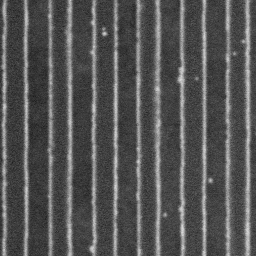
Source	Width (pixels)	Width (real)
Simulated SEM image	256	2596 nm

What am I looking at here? lines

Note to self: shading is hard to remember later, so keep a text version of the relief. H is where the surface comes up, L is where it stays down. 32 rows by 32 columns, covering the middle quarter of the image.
HLLLLLLHHHHHHLLLLLHHHHHLLLLLLLHH
HLLLLLLHHHHHHLLLLLLHHHHLLLLLLLHH
HLLLLLLHHHHHHLLLLLLHHHHLLLLLLHHH
HLLLLLLHHHHHHLLLLLLHHHHLLLLLLHHH
HLLLLLLHHHHHHLLLLLLHHHHLLLLLLHHH
HLLLLLLHHHHHHLLLLLHHHHHLLLLLLHHH
HLLLLLLHHHHHHLLLLLHHHHHLLLLLLHHH
HLLLLLLHHHHHHLLLLLHHHHHLLLLLLLHH
HLLLLLLHHHHHHLLLLLHHHHHLLLLLLLHH
HLLLLLLHHHHHHLLLLLLHHHHLLLLLLLHH
HLLLLLLHHHHHHLLLLLHHHHHLLLLLLHHH
HLLLLLLHHHHHHLLLLLHHHHHLLLLLLHHH
HLLLLLLHHHHHHLLLLLHHHHHLLLLLLHHH
HLLLLLLHHHHHHLLLLLHHHHHLLLLLLHHH
HLLLLLLHHHHHHLLLLLLHHHHLLLLLLLHH
HLLLLLLHHHHHHLLLLLLHHHHLLLLLLLHH
HLLLLLLHHHHHHLLLLLLHHHHLLLLLLHHH
HLLLLLLHHHHHHLLLLLLHHHHLLLLLLLHH
HLLLLLLHHHHHHLLLLLLHHHHLLLLLLLHH
HHLLLLLHHHHHHLLLLLLHHHHLLLLLLLHH
HLLLLLLHHHHHHLLLLLLHHHHLLLLLLLHH
HLLLLLLHHHHHHLLLLLLHHHHLLLLLLLHH
HLLLLLLHHHHHHLLLLLLHHHHLLLLLLLHH
HLLLLLLHHHHHHLLLLLLHHHHLLLLLLLHH
HLLLLLLHHHHHHLLLLLLHHHHLLLLLLLHH
HLLLLLLHHHHHHLLLLLLHHHHLLLLLLLHH
HLLLLLLHHHHHHLLLLLHHHHHLLLLLLHHH
HLLLLLLHHHHHHLLLLLLHHHHLLLLLLLHH
HLLLLLLHHHHHHLLLLLLHHHHLLLLLLLHH
HLLLLLLHHHHHHLLLLLLHHHHLLLLLLLHH
HLLLLLLHHHHHHLLLLLLHHHHHLLLLLLHH
HLLLLLLHHHHHHLLLLLLHHHHHLLLLLHHH